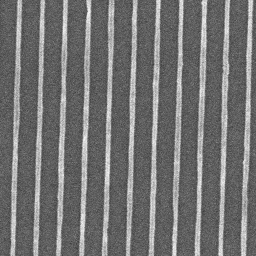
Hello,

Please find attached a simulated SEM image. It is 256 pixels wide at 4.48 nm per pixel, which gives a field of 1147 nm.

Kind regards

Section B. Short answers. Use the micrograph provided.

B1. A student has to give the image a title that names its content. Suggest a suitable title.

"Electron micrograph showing parallel lines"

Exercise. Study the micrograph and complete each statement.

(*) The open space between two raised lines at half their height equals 86.8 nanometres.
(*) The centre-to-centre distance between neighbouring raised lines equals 104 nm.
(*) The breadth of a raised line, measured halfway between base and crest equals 0.0191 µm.